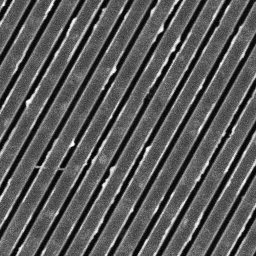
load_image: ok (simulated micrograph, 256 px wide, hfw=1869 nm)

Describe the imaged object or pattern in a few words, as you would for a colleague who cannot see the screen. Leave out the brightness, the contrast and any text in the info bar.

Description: parallel lines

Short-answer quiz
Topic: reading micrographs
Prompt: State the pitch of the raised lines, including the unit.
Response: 155 nm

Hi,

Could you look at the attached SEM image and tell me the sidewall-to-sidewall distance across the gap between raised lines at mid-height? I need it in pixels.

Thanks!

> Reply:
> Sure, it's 5.78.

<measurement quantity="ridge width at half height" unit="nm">114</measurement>